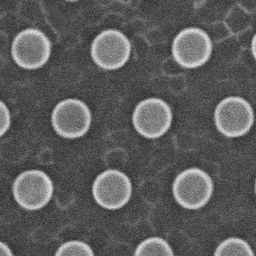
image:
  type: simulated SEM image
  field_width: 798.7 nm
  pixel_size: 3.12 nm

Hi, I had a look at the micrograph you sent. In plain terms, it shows a regular array of raised bodies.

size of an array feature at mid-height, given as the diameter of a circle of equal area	38.6	px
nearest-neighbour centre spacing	249	nm